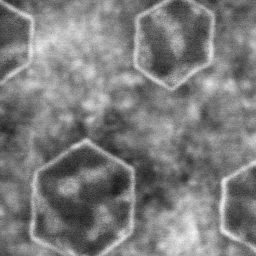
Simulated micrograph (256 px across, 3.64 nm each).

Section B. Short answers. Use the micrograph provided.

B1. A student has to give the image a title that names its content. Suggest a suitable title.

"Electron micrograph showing raised bodies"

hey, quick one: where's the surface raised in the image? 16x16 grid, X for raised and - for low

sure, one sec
X---------XXX---
XX-------XXXX---
XX------XXXXX---
XX------XXXXX---
X--------XXX----
----------------
----------------
----------------
----------------
----XXX---------
---XXXXX-------X
--XXXXXX------XX
--XXXXXX------XX
--XXXXXX------XX
--XXXXXX------XX
---XXXX---------